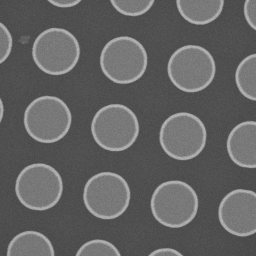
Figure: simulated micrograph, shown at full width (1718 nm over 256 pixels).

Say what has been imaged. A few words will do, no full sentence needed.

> an array of small figures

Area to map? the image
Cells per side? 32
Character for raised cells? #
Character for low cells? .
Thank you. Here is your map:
.......###....#####...######...#
...............###....######...#
.......................####....#
#...............................
#....####.......................
#...######...#####..............
#...######...#####....####......
#...######...#####...######...##
.....####....#####...######...##
.............#####...######..###
......................####....##
..............................##
....####........................
...#####.....###................
...######...#####....###........
...######..######...#####.....##
...#####....#####...######...###
.....##.....#####...######..####
.............###....#####...####
.....................###.....###
....#.........................##
...####.........................
..######...#####................
..######...#####....####........
..######..######...######...####
...####....#####...######...####
...........####....######..#####
....................####...#####
............................####
..####........................#.
.#####.....###..................
.######...#####....###..........